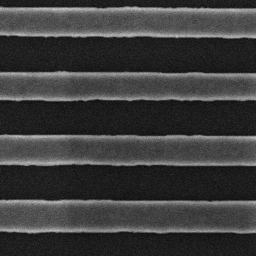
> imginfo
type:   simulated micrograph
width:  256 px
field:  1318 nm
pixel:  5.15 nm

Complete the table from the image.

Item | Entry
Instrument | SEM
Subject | lines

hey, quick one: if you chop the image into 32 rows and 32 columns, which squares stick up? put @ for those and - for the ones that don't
--------------------------------
@@@@@@@@@@@@@@@@@@@@@@@@@@@@@@@@
@@@@@@@@@@@@@@@@@@@@@@@@@@@@@@@@
@@@@@@@@@@@@@@@@@@@@@@@@@@@@@@@@
-----@---@@--@@@@--@@@@@@@@@@@@@
--------------------------------
--------------------------------
--------------------------------
--------------------------------
@@@@@@@@@@@@@@@@@@@@@@@@@@@@@@@@
@@@@@@@@@@@@@@@@@@@@@@@@@@@@@@@@
@@@@@@@@@@@@@@@@@@@@@@@@@@@@@@@@
--@--@@@@@@-----@--------@@---@-
--------------------------------
--------------------------------
--------------------------------
--------------------------------
@@@@@@@@@@@@@@@@@@@@@@@@@@@@@@@@
@@@@@@@@@@@@@@@@@@@@@@@@@@@@@@@@
@@@@@@@@@@@@@@@@@@@@@@@@@@@@@@@@
@@@@@@@@@-@@@@@@@@@@@@@@@@@@@@@@
--------------------------------
--------------------------------
--------------------------------
--------------------------------
@@@@@@@@@@@@@@@@@@@@@@@@@@@@@@@@
@@@@@@@@@@@@@@@@@@@@@@@@@@@@@@@@
@@@@@@@@@@@@@@@@@@@@@@@@@@@@@@@@
@@@@@@@@@@@@@@@@@@@@@@@@@@@@@@@@
--------------------------------
--------------------------------
--------------------------------